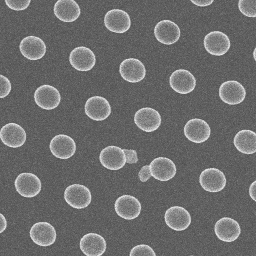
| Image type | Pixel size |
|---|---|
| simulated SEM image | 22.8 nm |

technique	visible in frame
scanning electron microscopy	a regular array of raised bodies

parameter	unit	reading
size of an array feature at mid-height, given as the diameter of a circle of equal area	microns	0.561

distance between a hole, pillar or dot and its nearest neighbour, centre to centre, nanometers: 1160